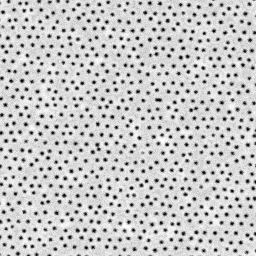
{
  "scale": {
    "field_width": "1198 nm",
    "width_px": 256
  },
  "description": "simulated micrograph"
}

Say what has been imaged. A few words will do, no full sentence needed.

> a regular array of holes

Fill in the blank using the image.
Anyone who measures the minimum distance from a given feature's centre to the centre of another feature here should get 8.14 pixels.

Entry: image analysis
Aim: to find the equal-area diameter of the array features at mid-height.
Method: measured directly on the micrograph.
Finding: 17.5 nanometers